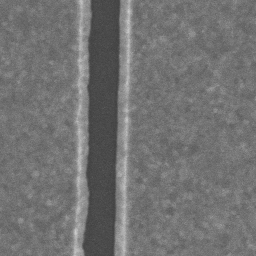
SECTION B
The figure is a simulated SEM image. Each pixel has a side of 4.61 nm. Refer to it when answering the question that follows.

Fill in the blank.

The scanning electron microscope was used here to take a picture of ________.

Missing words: one or a few lines or trenches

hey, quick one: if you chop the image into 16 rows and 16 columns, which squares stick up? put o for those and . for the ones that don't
ooooo...oooooooo
ooooo...oooooooo
ooooo...oooooooo
ooooo...oooooooo
ooooo...oooooooo
ooooo...oooooooo
ooooo...oooooooo
ooooo...oooooooo
ooooo...oooooooo
ooooo...oooooooo
ooooo...oooooooo
ooooo...oooooooo
ooooo...oooooooo
ooooo...oooooooo
ooooo...oooooooo
ooooo..ooooooooo